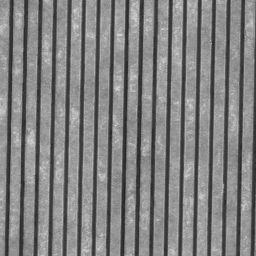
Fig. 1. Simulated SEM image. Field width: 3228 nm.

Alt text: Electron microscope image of parallel lines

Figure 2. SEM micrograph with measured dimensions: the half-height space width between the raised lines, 0.0536 µm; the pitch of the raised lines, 182 nm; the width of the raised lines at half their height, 129 nm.